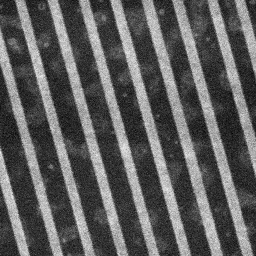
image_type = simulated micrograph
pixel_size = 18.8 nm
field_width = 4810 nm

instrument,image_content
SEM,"parallel lines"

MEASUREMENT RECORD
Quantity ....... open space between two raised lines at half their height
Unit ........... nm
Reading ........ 401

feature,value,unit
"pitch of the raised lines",576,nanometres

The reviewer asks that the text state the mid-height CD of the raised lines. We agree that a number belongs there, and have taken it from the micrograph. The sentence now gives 8.91 pixels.